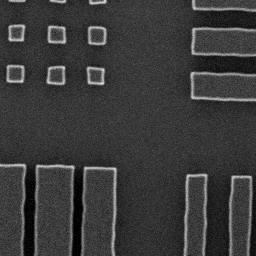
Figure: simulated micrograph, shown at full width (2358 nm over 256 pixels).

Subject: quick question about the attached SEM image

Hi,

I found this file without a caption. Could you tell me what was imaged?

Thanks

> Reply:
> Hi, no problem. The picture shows groups of lines, slits or small figures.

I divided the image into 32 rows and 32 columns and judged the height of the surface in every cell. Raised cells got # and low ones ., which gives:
........................########
................................
................................
.##...##...##...................
.##...##...##...........########
........................########
........................########
................................
.##...##...#....................
.##...##...##...........########
........................########
........................########
...........................#####
................................
................................
................................
................................
................................
................................
................................
................................
###..####..###..................
###..####..###.........###...##.
###..####..###.........###...##.
###.#####.####.........###...##.
###..####.####.........###...##.
###.#####.####.........###...##.
###.#####.####.........###...##.
###.#####.####.........###...##.
###.#####.####.........###...##.
###.#####.####.........###...##.
###.#####.####.........##....##.